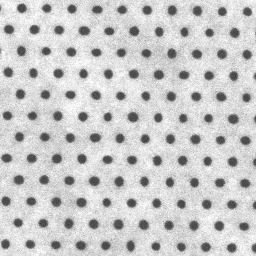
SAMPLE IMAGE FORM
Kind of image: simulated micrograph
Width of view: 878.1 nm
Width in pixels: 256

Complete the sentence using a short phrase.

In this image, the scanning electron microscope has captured a regular array of holes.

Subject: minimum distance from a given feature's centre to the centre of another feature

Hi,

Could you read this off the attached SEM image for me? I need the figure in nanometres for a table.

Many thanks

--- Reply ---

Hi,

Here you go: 84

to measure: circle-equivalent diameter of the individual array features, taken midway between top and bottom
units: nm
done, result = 31.4